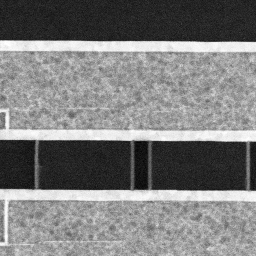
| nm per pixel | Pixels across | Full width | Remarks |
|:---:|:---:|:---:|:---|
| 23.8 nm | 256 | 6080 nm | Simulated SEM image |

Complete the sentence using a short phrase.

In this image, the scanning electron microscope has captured wiring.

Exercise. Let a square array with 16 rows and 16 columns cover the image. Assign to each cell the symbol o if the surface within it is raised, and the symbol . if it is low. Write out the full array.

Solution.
................
................
................
oooooooooooooooo
oooooooooooooooo
oooooooooooooooo
oooooooooooooooo
oooooooooooooooo
..........oooooo
................
................
................
oooooooooooooooo
oooooooooooooooo
oooooooooooooooo
oooooooooooooooo